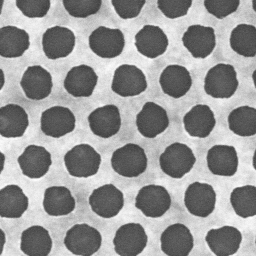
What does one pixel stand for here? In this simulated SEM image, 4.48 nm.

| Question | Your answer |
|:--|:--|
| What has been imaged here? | a regular array of holes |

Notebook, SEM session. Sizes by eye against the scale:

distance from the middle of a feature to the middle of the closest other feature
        0.202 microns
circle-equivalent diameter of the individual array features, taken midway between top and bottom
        0.154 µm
